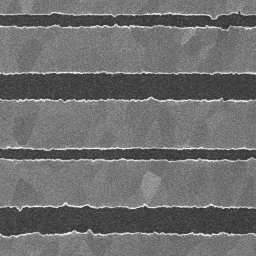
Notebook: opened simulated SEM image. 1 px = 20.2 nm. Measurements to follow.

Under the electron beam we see one or a few lines or trenches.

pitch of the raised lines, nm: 1350